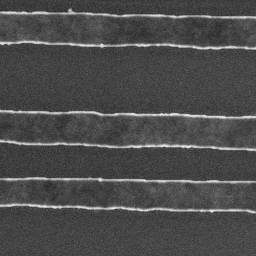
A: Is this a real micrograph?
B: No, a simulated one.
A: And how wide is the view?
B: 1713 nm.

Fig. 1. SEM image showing lines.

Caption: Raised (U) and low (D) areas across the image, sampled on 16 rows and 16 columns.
DDDDDDDDDDDDDDDD
UUUUUUUUUUUUUUUU
UUUUUUUUUUUUUUUU
DDDDDDDDDDDDDDDD
DDDDDDDDDDDDDDDD
DDDDDDDDDDDDDDDD
DDDDDDDDDDDDDDDD
UUUUUUUUUUUUUUUU
UUUUUUUUUUUUUUUU
DDDDDDDDDDDDDDDD
DDDDDDDDDDDDDDDD
UUUUUUUUUUUUUUUU
UUUUUUUUUUUUUUUU
DDDDDDDDDDDDDDDD
DDDDDDDDDDDDDDDD
DDDDDDDDDDDDDDDD